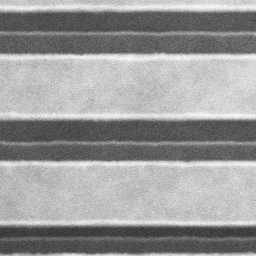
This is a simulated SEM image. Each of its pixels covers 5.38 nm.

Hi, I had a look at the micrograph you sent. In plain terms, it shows lines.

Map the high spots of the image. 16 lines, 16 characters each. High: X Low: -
XXXXXXXXXXXXXXXX
----------------
----------------
XXXXXXXXXXXXXXXX
XXXXXXXXXXXXXXXX
XXXXXXXXXXXXXXXX
XXXXXXXXXXXXXXXX
----------------
----------------
----------------
XXXXXXXXXXXXXXXX
XXXXXXXXXXXXXXXX
XXXXXXXXXXXXXXXX
XXXXXXXXXXXXXXXX
----------------
----------------